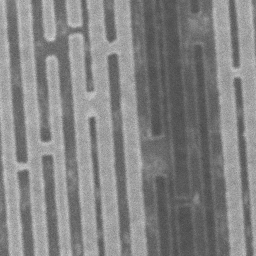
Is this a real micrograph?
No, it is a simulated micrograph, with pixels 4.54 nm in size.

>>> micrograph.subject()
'parallel lines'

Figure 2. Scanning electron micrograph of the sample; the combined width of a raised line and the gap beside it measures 24.6 pixels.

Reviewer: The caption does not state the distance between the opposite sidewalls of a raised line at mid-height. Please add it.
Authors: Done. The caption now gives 60.6 nm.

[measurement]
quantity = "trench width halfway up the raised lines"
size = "56.1 nanometers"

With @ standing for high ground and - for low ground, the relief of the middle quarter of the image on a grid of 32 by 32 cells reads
--@@@--@@@@---@@@----@@@--@@@@--
--@@@--@@@@---@@@----@@@--@@@@--
--@@@--@@@@---@@@----@@@--@@@@--
--@@@--@@@@---@@@----@@@--@@@@--
--@@@---@@@---@@@@---@@@--@@@@--
--@@@---@@@---@@@@---@@@--@@@@--
--@@@@-@@@@---@@@@---@@@--@@@@--
--@@@@@@@@@---@@@@---@@@--@@@@--
---@@@@@@@@---@@@@---@@@--@@@@--
---@@@@@@@@----@@@---@@@--@@@@--
---@@@@@@@@----@@@---@@@--@@@@--
---@@@@@@@@----@@@---@@@@-@@@@--
---@@@@@@@@----@@@---@@@@-@@@@@-
---@@@--@@@@---@@@---@@@@-@@@@@-
---@@@--@@@@---@@@---@@@@-@@@@@-
---@@@--@@@@---@@@---@@@@-@@@@@-
---@@@--@@@@---@@@---@@@@--@@@@-
---@@@--@@@@---@@@----@@@--@@@@-
---@@@---@@@---@@@@---@----@@@@-
---@@@---@@@---@@@@--------@@@@-
---@@@@--@@@---@@@@--------@@@@-
---@@@@--@@@---@@@@--------@@@@-
----@@@--@@@---@@@@--------@@@@-
---@@@@--@@@----@@@--------@@@@-
---@@@@--@@@----@@@--------@@@@-
----@@@--@@@----@@@--------@@@@-
----@@@--@@@----@@@--------@@@@-
-@--@@@--@@@@---@@@-----@---@@@-
----@@@--@@@@---@@@---@@@@--@@@-
----@@@--@@@@---@@@---@@@@--@@@@
----@@@--@@@@---@@@---@@@@--@@@@
----@@@--@@@@---@@@----@@@--@@@@